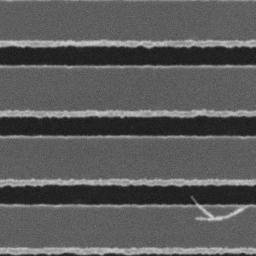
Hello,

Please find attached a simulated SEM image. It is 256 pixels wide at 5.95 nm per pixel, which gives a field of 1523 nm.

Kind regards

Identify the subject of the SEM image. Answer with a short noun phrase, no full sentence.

lines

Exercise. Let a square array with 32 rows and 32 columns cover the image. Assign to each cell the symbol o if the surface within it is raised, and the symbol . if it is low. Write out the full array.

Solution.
oooooooooooooooooooooooooooooooo
oooooooooooooooooooooooooooooooo
oooooooooooooooooooooooooooooooo
oooooooooooooooooooooooooooooooo
oooooooooooooooooooooooooooooooo
oooooooooooooooooooooooooooooooo
................................
................................
oooooooooooooooooooooooooooooooo
oooooooooooooooooooooooooooooooo
oooooooooooooooooooooooooooooooo
oooooooooooooooooooooooooooooooo
oooooooooooooooooooooooooooooooo
oooooooooooooooooooooooooooooooo
ooooooooooo.oooooooo.oooo.oooooo
................................
................................
oooooooooooooooooooooooooooooooo
oooooooooooooooooooooooooooooooo
oooooooooooooooooooooooooooooooo
oooooooooooooooooooooooooooooooo
oooooooooooooooooooooooooooooooo
oooooooooooooooooooooooooooooooo
................................
................................
................................
oooooooooooooooooooooooooooooooo
oooooooooooooooooooooooooooooooo
oooooooooooooooooooooooooooooooo
oooooooooooooooooooooooooooooooo
oooooooooooooooooooooooooooooooo
oooooooooooooooooooooooooooooooo